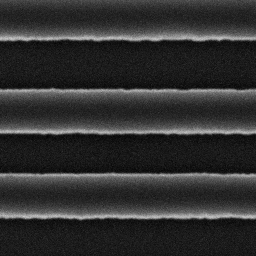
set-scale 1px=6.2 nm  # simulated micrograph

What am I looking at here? lines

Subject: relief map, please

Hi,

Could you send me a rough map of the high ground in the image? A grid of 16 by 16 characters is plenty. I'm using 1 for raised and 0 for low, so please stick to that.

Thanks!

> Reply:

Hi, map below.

1111111111111111
1111111111111111
0000000000000000
0000000000000000
0000000000000000
0000000000000000
1111111111111111
1111111111111111
0000000000000000
0000000000000000
0000000000000000
1111111111111111
1111111111111111
1111111111111111
0000000000000000
0000000000000000